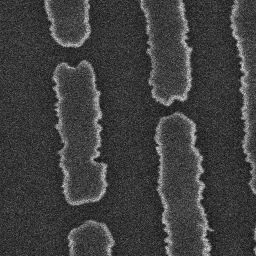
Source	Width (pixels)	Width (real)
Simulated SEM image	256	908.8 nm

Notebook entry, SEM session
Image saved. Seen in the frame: one or a few lines or trenches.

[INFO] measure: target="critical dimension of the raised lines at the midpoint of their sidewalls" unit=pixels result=40.2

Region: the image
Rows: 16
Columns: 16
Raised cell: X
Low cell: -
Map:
---XXX---XX----X
---XXX---XXX--XX
----X----XXX---X
---------XXX---X
---XXX---XXX---X
---XXX---XXX---X
----XX---------X
----XX----XX---X
----XX----XX---X
----XX----XX---X
----XX----XXX---
----XXX---XXX---
----XX----XXX---
----------XXX---
-----XX---XXX---
----XXX---XXX---